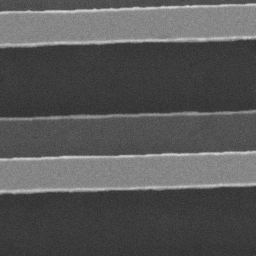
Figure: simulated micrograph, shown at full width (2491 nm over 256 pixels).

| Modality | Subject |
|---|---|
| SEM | lines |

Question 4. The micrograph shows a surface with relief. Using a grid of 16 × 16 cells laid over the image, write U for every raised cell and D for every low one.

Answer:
UUUUUUUUUUUUUUUU
UUUUUUUUUUUUUUUU
UUUUUUUUUUUUUDDD
DDDDDDDDDDDDDDDD
DDDDDDDDDDDDDDDD
DDDDDDDDDDDDDDDD
DDDDDDDDDDDDDDDD
UUUUUUUUUUUUUUUU
UUUUUUUUUUUUUUUU
UUUUUUUUUUUUUUUU
UUUUUUUUUUUUUUUU
UUUUUUUUUUUUUUUU
DDDDDDDDDDDDDDDD
DDDDDDDDDDDDDDDD
DDDDDDDDDDDDDDDD
DDDDDDDDDDDDDDDD